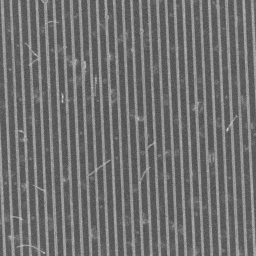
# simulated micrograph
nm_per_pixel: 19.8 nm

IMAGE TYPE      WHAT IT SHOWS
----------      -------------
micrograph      parallel lines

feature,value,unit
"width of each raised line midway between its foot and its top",37.2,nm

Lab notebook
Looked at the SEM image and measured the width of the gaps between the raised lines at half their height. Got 136 nm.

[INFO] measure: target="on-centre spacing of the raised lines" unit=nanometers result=171